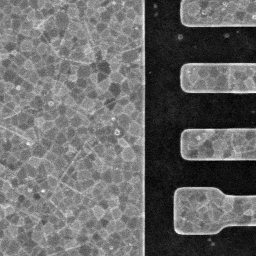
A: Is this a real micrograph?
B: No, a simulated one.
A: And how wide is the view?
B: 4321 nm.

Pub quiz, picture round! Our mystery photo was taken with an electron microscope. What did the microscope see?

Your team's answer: wiring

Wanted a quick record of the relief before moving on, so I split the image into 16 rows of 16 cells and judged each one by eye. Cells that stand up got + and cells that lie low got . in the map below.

+++++++++..+++++
+++++++++...++++
+++++++++.......
+++++++++.......
+++++++++..+++++
+++++++++...++++
+++++++++.......
+++++++++.......
+++++++++..+++++
+++++++++..+++++
+++++++++.......
+++++++++.......
+++++++++..+++++
+++++++++..+++++
+++++++++..+++..
+++++++++.......